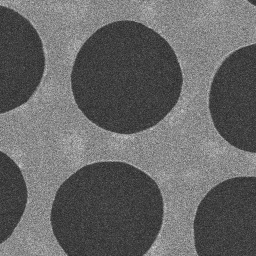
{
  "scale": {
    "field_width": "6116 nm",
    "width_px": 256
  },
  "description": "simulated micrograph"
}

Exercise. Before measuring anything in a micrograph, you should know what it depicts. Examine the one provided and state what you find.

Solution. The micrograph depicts holes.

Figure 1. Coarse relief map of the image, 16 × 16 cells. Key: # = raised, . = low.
.###############
..#####..#######
...##.....######
...##......###..
...#.......##...
..##.......##...
.####......##...
######....###...
##############..
################
.####....#######
..##......####..
..#.......###...
.##.......##....
.##.......##....
####.....###....